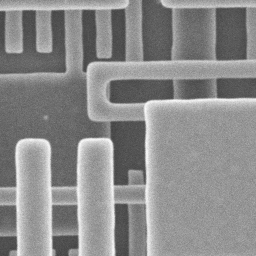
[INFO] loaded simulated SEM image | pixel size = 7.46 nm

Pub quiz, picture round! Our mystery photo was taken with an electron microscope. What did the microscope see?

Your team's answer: wiring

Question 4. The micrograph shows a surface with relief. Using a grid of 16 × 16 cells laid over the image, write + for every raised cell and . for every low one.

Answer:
................
................
................
................
................
................
.........+++++++
.........+++++++
.........+++++++
.++..++..+++++++
.++..++..+++++++
.++..++..+++++++
.++..++..+++++++
.++..++..+++++++
.++..++..+++++++
.++..++..+++++++